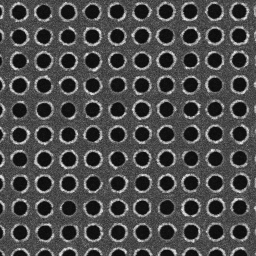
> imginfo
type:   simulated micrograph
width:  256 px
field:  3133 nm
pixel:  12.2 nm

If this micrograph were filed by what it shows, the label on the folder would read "a regular array of holes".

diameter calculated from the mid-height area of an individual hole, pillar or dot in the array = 180 nanometers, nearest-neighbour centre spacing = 294 nm